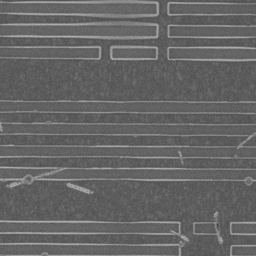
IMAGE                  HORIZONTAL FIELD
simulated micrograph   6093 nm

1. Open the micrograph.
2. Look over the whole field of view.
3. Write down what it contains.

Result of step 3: groups of lines, slits or small figures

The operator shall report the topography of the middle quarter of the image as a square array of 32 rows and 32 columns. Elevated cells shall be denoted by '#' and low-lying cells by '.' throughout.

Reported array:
################################
################################
################################
################################
################################
################################
################################
################################
################################
................................
................................
................................
################################
################################
################################
................................
................................
................................
################################
################################
.###############################
................................
................................
##################...........#..
################################
################################
................................
................................
................................
################################
################################
################################